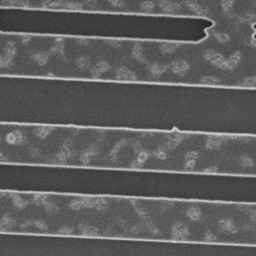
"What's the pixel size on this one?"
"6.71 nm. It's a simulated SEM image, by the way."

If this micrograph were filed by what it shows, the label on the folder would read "one or a few lines or trenches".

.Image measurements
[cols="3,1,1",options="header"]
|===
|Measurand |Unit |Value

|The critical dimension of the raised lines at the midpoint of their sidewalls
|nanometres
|288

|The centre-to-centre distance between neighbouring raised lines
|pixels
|77.4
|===